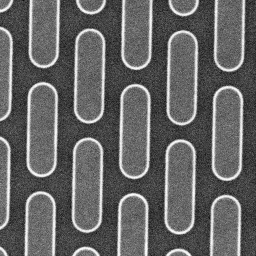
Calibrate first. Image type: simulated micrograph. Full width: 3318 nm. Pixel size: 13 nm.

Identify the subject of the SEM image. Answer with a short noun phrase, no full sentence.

groups of lines, slits or small figures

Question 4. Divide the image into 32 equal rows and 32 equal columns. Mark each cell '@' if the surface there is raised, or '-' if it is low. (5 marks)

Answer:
@---@@@---@@@--@@@@--@@@@--@@@--
----@@@----@---@@@@---@@---@@@--
----@@@--------@@@@--------@@@--
----@@@--------@@@@--------@@@--
@---@@@---@@@--@@@@---@@---@@@--
@---@@@---@@@--@@@@--@@@@--@@@--
@---@@@---@@@--@@@@--@@@@--@@@--
@---@@@---@@@--@@@@--@@@---@@@--
@---------@@@--------@@@----@@--
@---------@@@--------@@@--------
@----@----@@@--------@@@--------
@---@@@--@@@@--@@@---@@@---@@@--
@---@@@--@@@@--@@@@--@@@---@@@--
@---@@@--@@@@--@@@@--@@@---@@@--
@---@@@---@@@--@@@@--@@@---@@@--
----@@@--------@@@@--------@@@--
----@@@--------@@@@--------@@@--
----@@@---@@---@@@@--------@@@--
@--@@@@--@@@@--@@@@--@@@---@@@--
@--@@@@--@@@@--@@@@--@@@---@@@--
@--@@@@--@@@@--@@@---@@@---@@@--
@---@@---@@@@--@@@---@@@---@@@--
@--------@@@@--------@@@--------
@--------@@@@--------@@@--------
@---@@---@@@@---@----@@@--------
@--@@@@--@@@@--@@@---@@@---@@@--
@--@@@@--@@@@--@@@---@@@---@@@--
@--@@@@--@@@@--@@@---@@@---@@@--
---@@@@---@@---@@@---@@@---@@@--
---@@@@--------@@@---------@@@--
---@@@@--------@@@--------@@@@--
@--@@@@---@@---@@@---@@---@@@@--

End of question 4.